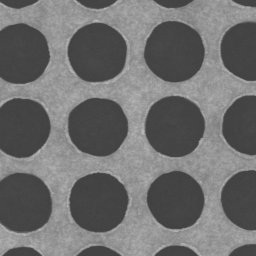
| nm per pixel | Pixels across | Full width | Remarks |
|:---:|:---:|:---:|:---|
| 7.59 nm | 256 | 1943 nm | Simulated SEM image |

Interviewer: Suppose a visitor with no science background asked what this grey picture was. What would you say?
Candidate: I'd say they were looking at holes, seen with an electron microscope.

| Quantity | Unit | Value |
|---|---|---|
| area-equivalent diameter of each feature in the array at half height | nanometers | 453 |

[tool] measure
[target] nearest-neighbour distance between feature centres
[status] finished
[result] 562 nm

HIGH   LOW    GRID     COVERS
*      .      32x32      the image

....******....******...*******..
********************************
********************************
....******....*****.....*****...
......***......****......***....
......***.......**.......***....
......**........**........**....
......***.......**.......***....
......***......****......***....
.....*****....******....******..
********************************
********************************
*...*******...******....******..
.....****......****......****...
......***.......**.......***....
......**........**........**....
......***.......**.......***....
......***.......***......***....
.....*****.....****......****...
*...********.********..*********
********************************
*********************..*******..
.....*****.....****.....*****...
......***.......***......***....
......***.......**.......***....
......***.......**.......***....
......***.......***......***....
......***......*****.....****...
*....*****....*******..*******..
********************************
*******************************.
*....*****....******....*****...